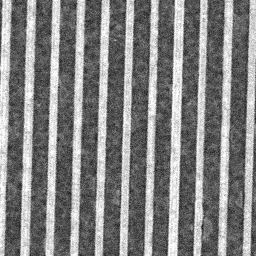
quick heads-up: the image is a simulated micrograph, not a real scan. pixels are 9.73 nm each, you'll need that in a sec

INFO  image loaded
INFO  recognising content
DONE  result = parallel lines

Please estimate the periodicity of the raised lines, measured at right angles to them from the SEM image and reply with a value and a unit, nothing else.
24.6 pixels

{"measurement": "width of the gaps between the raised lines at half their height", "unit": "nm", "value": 171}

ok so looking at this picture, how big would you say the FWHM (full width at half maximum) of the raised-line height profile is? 68.1 nm